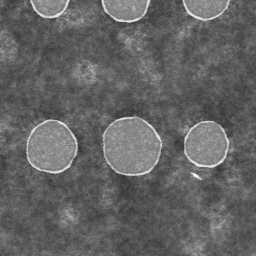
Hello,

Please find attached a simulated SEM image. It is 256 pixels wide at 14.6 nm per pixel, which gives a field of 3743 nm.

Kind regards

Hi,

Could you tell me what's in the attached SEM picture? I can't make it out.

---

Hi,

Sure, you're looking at raised bodies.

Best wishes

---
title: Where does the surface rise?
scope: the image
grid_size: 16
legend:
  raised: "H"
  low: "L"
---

LLHHLLLHHLLLHHLL
LLLLLLLLLLLLLLLL
LLLLLLLLLLLLLLLL
LLLLLLLLLLLLLLLL
LLLLLLLLLLLLLLLL
LLLLLLLLLLLLLLLL
LLLLLLLLLLLLLLLL
LLLLLLLHHLLLLLLL
LLHHHLLHHHLLHHLL
LLHHHLLHHHLLHHLL
LLHHLLLHHLLLLLLL
LLLLLLLLLLLLLLLL
LLLLLLLLLLLLLLLL
LLLLLLLLLLLLLLLL
LLLLLLLLLLLLLLLL
LLLLLLLLLLLLLLLL